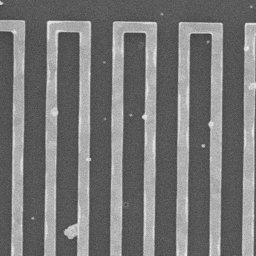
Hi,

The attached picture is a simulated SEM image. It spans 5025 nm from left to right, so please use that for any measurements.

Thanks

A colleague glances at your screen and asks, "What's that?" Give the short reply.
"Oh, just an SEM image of groups of lines, slits or small figures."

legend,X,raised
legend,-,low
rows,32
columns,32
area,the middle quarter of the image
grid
----XX------XXX------XX------XX-
----XX------XXX------XX------XX-
----XX------XXX------XX------XX-
----XX------XXX------XX------XX-
----XX------XXX------XX------XX-
----XX------XXX------XX------XX-
----XX------XXX------XX------XX-
----XX------XXX------XX------XX-
----XX------XXX------XX------XX-
----XX------XXX-----XXX------XX-
----XX------XXX-----XXX------XX-
----XX------XXX-----XXX------XX-
----XX------XXX-----XXX------XX-
----XX------XXX-----XXX------XX-
----XX------XXX-----XXX------XX-
----XX------XXX-----XXX------XX-
----XX------XXX-----XXX------XX-
----XX------XXX-----XXX------XX-
----XX------XXX------XX------XX-
----XX------XXX-----XXX------XX-
----XX------XXX-----XXX------XX-
----XX------XXX-----XXX------XX-
----XX------XXX-----XXX------XX-
----XX------XX------XXX------XX-
----XX------XX------XXX------XX-
----XX------XX------XXX------XX-
----XX------XX------XXX------XX-
----XX------XX------XXX------XX-
----XX------XX------XXX------XX-
----XX------XX------XXX------XX-
----XX------XX------XXX------XX-
----XX------XX------XXX------XX-